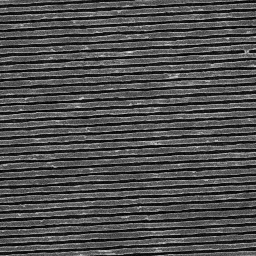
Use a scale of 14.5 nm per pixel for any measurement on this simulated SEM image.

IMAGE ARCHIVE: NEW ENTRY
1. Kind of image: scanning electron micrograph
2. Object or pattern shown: parallel lines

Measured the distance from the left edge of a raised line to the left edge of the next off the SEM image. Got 119 nm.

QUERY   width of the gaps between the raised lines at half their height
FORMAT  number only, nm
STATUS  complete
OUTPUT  50.7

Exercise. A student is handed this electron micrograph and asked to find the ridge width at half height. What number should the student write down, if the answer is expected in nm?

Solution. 76